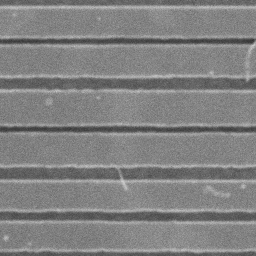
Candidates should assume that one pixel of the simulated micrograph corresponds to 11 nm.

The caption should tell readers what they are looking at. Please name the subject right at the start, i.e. lines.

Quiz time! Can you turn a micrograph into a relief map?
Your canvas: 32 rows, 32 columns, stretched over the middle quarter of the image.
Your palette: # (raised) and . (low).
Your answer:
################################
################################
################################
................................
................................
................................
.............##.................
################################
################################
################################
################################
################################
################################
################################
################################
..........................##....
................................
################################
################################
################################
################################
################################
################################
################################
################################
#####################.##########
................................
................................
................................
################################
################################
################################